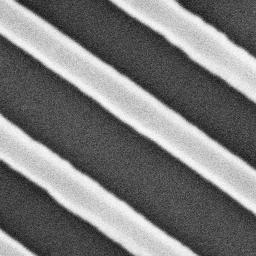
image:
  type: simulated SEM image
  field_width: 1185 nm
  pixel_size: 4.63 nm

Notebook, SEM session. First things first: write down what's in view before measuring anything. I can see lines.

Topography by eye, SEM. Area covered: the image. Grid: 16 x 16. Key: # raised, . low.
#.......###.....
###......####...
.###.......###..
..####......####
....###.......##
.....####......#
......####......
........###.....
##.......####...
###........###..
.###........####
..####........##
....###........#
.....####.......
.......###......
#.......###.....